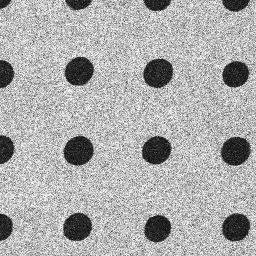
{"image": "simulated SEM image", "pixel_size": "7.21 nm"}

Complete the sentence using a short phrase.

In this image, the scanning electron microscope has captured a regular array of holes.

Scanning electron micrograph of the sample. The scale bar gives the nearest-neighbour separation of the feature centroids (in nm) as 553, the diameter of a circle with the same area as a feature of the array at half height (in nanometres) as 206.